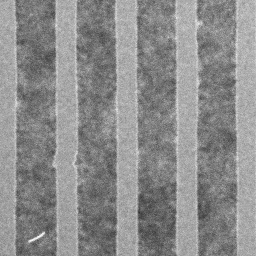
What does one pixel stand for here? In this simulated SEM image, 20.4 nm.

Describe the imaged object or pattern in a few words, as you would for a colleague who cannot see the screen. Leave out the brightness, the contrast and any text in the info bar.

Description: parallel lines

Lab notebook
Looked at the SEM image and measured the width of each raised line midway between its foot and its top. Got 410 nm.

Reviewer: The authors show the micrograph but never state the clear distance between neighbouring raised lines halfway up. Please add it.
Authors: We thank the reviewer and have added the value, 40.2 px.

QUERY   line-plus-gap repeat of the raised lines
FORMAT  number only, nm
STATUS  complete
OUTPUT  1220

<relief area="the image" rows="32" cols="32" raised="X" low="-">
XX-----XX------XX-----XX------XX
XX-----XX------XX-----XX------XX
XX-----XX------XX-----XX------XX
XX-----XX------XX-----XX------XX
XX-----XX------XX-----XX------XX
XX-----XX------XX-----XXX-----XX
XX-----XX------XX-----XXX-----XX
XX-----XX------XX-----XXX-----XX
XX-----XX------XX-----XXX-----XX
XX-----XXX-----XX-----XXX-----XX
XX-----XXX-----XX-----XXX-----XX
XX-----XXX-----XX-----XXX-----XX
XX-----XXX-----XX-----XXX-----XX
XX-----XXX-----XX-----XXX-----XX
XX-----XXX-----XX-----XXX-----XX
XX-----XXX-----XX-----XXX-----XX
XX-----XXX-----XX-----XXX-----XX
XX-----XXX-----XX-----XXX-----XX
XX-----XXX-----XX-----XXX-----XX
XX-----XX------XX-----XX------XX
XX-----XX------XX-----XXX-----XX
XX-----XXX-----XX-----XXX-----XX
XX-----XXX-----XX-----XX------XX
XX-----XXX-----XX-----XXX-----XX
XX-----XXX-----XX-----XXX-----XX
XX-----XXX-----XX-----XXX-----XX
XX-----XXX-----XX-----XXX-----XX
XX-----XXX-----XX-----XXX-----XX
XX-----XXX-----XX-----XXX-----XX
XX-----XXX-----XX-----XXX-----XX
XX-----XXX-----XX-----XXX-----XX
XX-----XXX-----XX-----XXX-----XX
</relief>